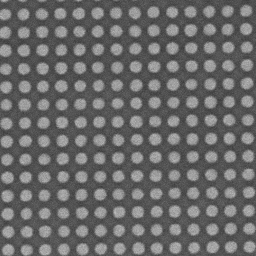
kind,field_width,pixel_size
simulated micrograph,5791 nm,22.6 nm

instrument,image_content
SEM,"a regular array of raised bodies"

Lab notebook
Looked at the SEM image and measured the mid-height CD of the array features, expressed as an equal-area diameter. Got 262 nanometers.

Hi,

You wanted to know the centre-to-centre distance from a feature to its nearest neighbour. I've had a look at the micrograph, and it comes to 407 nanometres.